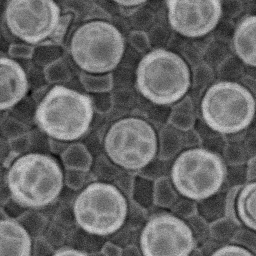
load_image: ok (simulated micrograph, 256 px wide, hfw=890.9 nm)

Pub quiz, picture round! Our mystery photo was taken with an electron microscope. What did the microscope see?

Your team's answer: a regular array of raised bodies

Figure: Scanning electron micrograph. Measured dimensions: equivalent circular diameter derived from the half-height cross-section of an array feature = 0.173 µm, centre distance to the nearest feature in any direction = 250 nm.